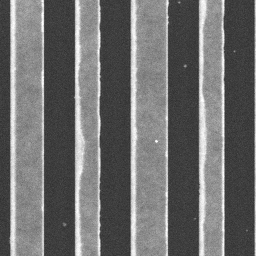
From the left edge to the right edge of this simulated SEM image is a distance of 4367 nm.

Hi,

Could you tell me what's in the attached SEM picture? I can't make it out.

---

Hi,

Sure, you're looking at lines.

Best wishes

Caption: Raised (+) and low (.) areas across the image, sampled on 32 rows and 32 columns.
.++++....+++.....++++....+++....
.++++....+++.....++++....+++....
.++++....+++.....++++....+++....
.++++....+++....+++++....+++....
.++++....+++.....++++....+++....
.++++....+++.....++++....+++....
.++++....+++.....++++....+++....
.++++....+++.....++++....+++....
.++++....+++.....++++....+++....
.++++....+++.....++++....+++....
.++++....+++.....++++....+++....
.++++....+++.....++++....+++....
.++++....+++.....++++....+++....
.++++....+++.....++++....+++....
.++++....+++....+++++....+++....
.++++....+++....+++++....+++....
.++++....+++.....++++....+++....
.++++.....++.....++++....+++....
.++++.....++....+++++....+++....
.++++.....++....+++++....+++....
.++++.....++....+++++....+++....
.++++....+++....+++++....+++....
.++++....+++.....++++....+++....
.++++....+++.....++++....+++....
.++++....+++.....++++....+++....
.++++....+++....+++++....+++....
.++++....+++....+++++....+++....
.++++....+++.....++++....+++....
.++++....+++....+++++....+++....
.++++....+++....+++++....+++....
.++++....+++....+++++....+++....
.++++....+++....+++++....+++....